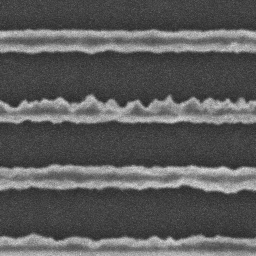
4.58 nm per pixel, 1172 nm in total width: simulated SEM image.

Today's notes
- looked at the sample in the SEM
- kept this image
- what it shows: one or a few lines or trenches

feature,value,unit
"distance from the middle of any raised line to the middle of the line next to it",0.313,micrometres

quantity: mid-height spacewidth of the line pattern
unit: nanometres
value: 244